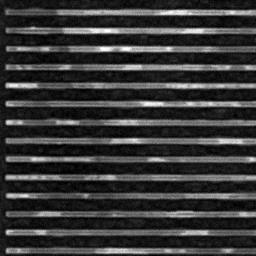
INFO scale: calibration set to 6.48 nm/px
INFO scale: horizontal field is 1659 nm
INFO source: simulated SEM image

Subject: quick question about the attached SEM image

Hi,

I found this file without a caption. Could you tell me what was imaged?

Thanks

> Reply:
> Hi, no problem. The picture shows parallel lines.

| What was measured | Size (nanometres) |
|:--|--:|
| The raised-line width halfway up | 27.6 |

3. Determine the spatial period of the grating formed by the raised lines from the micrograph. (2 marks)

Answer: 119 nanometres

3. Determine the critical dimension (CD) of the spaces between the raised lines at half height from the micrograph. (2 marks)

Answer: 0.0932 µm